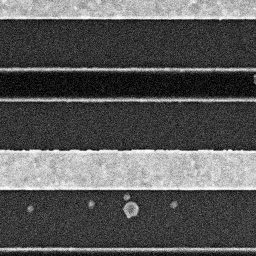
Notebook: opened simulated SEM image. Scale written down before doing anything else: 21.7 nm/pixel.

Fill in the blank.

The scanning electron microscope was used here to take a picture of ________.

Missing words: lines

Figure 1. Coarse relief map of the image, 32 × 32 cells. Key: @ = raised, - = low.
@@@@@@@@@@@@@@@@@@@@@@@@@@@@@@@@
@@@@@@@@@@@@@@@@@@@@@@@@@@@@@@@@
--------------------------------
--------------------------------
--------------------------------
--------------------------------
--------------------------------
--------------------------------
--------------------------------
@@@@@@@@@@@@@@@@@@@@@@@@@@@@@@@@
@@@@@@@@@@@@@@@@@@@@@@@@@@@@@@@@
@@@@@@@@@@@@@@@@@@@@@@@@@@@@@@@@
--------@-@@@----@--@@---@@-----
--------------------------------
--------------------------------
--------------------------------
--------------------------------
--------------------------------
--------------------------------
@@@@@@@@@@@@@@@@@@@@@@@@@@@@@@@@
@@@@@@@@@@@@@@@@@@@@@@@@@@@@@@@@
@@@@@@@@@@@@@@@@@@@@@@@@@@@@@@@@
@@@@@@@@@@@@@@@@@@@@@@@@@@@@@@@@
@@@@@@@@@@@@@@@@@@@@@@@@@@@@@@@@
--------------------------------
--------------------------------
--------------------------------
--------------------------------
--------------------------------
--------------------------------
--------------------------------
@@@@@@@@@@@@@@@@@@@@@@@@@@@@@@@@